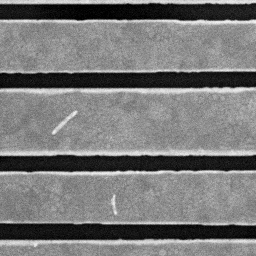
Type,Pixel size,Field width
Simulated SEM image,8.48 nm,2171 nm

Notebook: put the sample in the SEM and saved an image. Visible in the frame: lines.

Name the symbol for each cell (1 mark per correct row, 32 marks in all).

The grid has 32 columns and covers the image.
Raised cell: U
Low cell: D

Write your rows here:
DDDDDDDDDDDDDDDDDDDDDDDDDDDDDDDD
DDDDDDDDDDDDDDDDDDDDDDDDDDDDDDDD
DDDDDDDDDDDDDDDDDDDDDDDDDDDDDDDD
UUUUUUUUUUUUUUUUUUUUUUUUUUUUUUUU
UUUUUUUUUUUUUUUUUUUUUUUUUUUUUUUU
UUUUUUUUUUUUUUUUUUUUUUUUUUUUUUUU
UUUUUUUUUUUUUUUUUUUUUUUUUUUUUUUU
UUUUUUUUUUUUUUUUUUUUUUUUUUUUUUUU
UUUUUUUUUUUUUUUUUUUUUUUUUUUUUUUU
DDDDDDDDDDDDDDDDDDDDDDDDDDDDDDDD
DDDDDDDDDDDDDDDDDDDDDDDDDDDDDDDD
UUUUUUUUUUUUUUUUUUUUUUUUUUUUUUUU
UUUUUUUUUUUUUUUUUUUUUUUUUUUUUUUU
UUUUUUUUUUUUUUUUUUUUUUUUUUUUUUUU
UUUUUUUUUUUUUUUUUUUUUUUUUUUUUUUU
UUUUUUUUUUUUUUUUUUUUUUUUUUUUUUUU
UUUUUUUUUUUUUUUUUUUUUUUUUUUUUUUU
UUUUUUUUUUUUUUUUUUUUUUUUUUUUUUUU
UUUUUUUUUUUUUUUUUUUUUUUUUUUUUUUU
DDDDDDDDDDDDDDDDDDDDDDDDDDDDDDDD
DDDDDDDDDDDDDDDDDDDDDDDDDDDDDDDD
DDDDDDDDDDDDDDDDDDDDUUDDDUUDDUUU
UUUUUUUUUUUUUUUUUUUUUUUUUUUUUUUU
UUUUUUUUUUUUUUUUUUUUUUUUUUUUUUUU
UUUUUUUUUUUUUUUUUUUUUUUUUUUUUUUU
UUUUUUUUUUUUUUUUUUUUUUUUUUUUUUUU
UUUUUUUUUUUUUUUUUUUUUUUUUUUUUUUU
UUUUUUUUUUUUUUUUUUUUUUUUUUUUUUUU
DDDDDDDDDDDDDDDDDDDDDDDDDDDDDDDD
DDDDDDDDDDDDDDDDDDDDDDDDDDDDDDDD
UUUUUUUUUUUUUUUUUUUUUUUUUUUUUUUU
UUUUUUUUUUUUUUUUUUUUUUUUUUUUUUUU